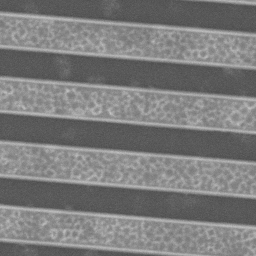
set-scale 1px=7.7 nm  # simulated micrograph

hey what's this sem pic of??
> parallel lines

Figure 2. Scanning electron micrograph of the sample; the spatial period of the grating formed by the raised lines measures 494 nm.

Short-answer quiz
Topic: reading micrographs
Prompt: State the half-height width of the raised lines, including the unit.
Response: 0.247 um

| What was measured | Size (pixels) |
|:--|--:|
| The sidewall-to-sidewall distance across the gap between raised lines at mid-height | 32.1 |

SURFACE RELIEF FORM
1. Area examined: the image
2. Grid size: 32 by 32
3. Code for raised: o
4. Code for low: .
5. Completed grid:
................................
................................
ooooooooo.......................
ooooooooooooooooooooo...........
ooooooooooooooooooooooooooooooo.
oooooooooooooooooooooooooooooooo
.........ooooooooooooooooooooooo
.....................ooooooooooo
................................
................................
ooooooo.........................
oooooooooooooooooooo............
ooooooooooooooooooooooooooooooo.
oooooooooooooooooooooooooooooooo
.........ooooooooooooooooooooooo
.....................ooooooooooo
................................
................................
oooooooo........................
oooooooooooooooooooo............
ooooooooooooooooooooooooooooooo.
oooooooooooooooooooooooooooooooo
........oooooooooooooooooooooooo
....................oooooooooooo
................................
................................
ooooooo.........................
ooooooooooooooooooo.............
ooooooooooooooooooooooooooooooo.
oooooooooooooooooooooooooooooooo
.......ooooooooooooooooooooooooo
...................ooooooooooooo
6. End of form